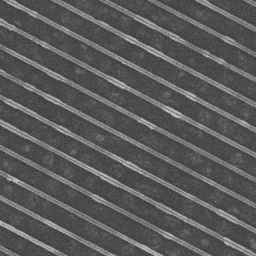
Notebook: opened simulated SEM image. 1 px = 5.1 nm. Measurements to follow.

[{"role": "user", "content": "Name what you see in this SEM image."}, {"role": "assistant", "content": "parallel lines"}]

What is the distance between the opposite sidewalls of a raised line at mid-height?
19.2 nanometres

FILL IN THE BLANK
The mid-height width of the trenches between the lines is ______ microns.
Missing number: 0.0948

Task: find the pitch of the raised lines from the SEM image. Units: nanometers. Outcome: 114